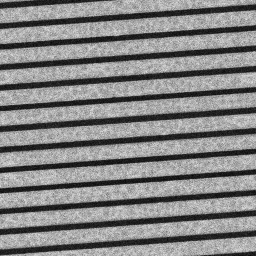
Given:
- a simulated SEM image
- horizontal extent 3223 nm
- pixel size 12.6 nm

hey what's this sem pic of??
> parallel lines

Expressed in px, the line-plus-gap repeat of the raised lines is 20.5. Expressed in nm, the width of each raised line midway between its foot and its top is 190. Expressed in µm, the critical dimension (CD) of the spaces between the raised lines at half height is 0.0738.